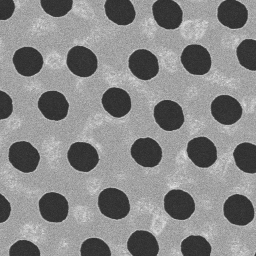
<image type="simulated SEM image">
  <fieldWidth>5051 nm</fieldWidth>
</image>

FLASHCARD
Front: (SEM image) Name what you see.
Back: a regular array of holes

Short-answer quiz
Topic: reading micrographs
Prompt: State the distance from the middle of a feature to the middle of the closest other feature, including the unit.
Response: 1020 nm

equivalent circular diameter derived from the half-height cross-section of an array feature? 606 nm